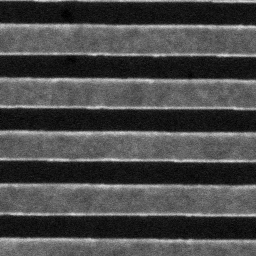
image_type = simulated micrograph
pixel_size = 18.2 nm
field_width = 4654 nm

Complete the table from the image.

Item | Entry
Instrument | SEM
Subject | lines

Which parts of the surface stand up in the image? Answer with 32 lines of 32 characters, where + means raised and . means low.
................................
................................
................................
++++++++++++++++++++++++++++++++
++++++++++++++++++++++++++++++++
++++++++++++++++++++++++++++++++
++++++++++++++++++++++++++++++++
................................
................................
................................
++++++++++++++++++++++++++++++++
++++++++++++++++++++++++++++++++
++++++++++++++++++++++++++++++++
...........+++++++++++++++++++++
................................
................................
................................
++++++++++++++++++++++++++++++++
++++++++++++++++++++++++++++++++
++++++++++++++++++++++++++++++++
................................
................................
................................
+++++++++++++++++++++++++++..+++
++++++++++++++++++++++++++++++++
++++++++++++++++++++++++++++++++
++++++++++++++++++++++++++++++++
................................
................................
................................
++++++++++++++++++++++++++++++++
++++++++++++++++++++++++++++++++